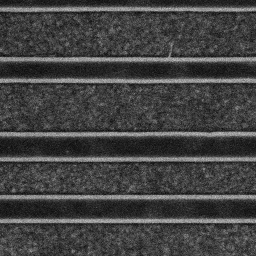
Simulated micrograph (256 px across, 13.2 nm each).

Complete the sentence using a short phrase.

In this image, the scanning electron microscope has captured one or a few lines or trenches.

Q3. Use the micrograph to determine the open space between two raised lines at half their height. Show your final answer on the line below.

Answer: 0.651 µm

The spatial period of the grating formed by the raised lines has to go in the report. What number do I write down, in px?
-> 69.4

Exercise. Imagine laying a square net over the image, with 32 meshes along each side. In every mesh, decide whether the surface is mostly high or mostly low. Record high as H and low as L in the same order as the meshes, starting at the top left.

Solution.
HHHHHHHHHHHHHHHHHHHHHHHHHHHHHHHH
LLLLLLLLLLLLLLLLLLLLLLLLLLLLLLLL
LLLLLLLLLLLLLLLLLLLLLLLLLLLLLLLL
LLLLLLLLLLLLLLLLLLLLLLLLLLLLLLLL
LLLLLLLLLLLLLLLLLLLLLLLLLLLLLLLL
LLLLLLLLLLLLLLLLLLLLLLLLLLLLLLLL
LLLLLLLLLLLLLLLLLLLLLLLLLLLLLLLL
HHHHHHHHHHHHHHHHHHHHHHHHHHHHHHHH
HHHHHHHHHHHHHHHHHHHHHHHHHHHHHHHH
HHHHHHHHHHHHHHHHHHHHHHHHHHHHHHHH
LLLLLLLLLLLLLLLLLLLLLLLLLLLLLLLL
LLLLLLLLLLLLLLLLLLLLLLLLLLLLLLLL
LLLLLLLLLLLLLLLLLLLLLLLLLLLLLLLL
LLLLLLLLLLLLLLLLLLLLLLLLLLLLLLLL
LLLLLLLLLLLLLLLLLLLLLLLLLLLLLLLL
LLLLLLLLLLLLLLLLLLLLLLLLLLLLLLLL
LLLLLLLLLLLLLLLLLLLLLLLLLLLLLLLL
HHHHHHHHHHHHHHHHHHHHHHHHHHHHHHHH
HHHHHHHHHHHHHHHHHHHHHHHHHHHHHHHH
HHHHHHHHHHHHHHHHHHHHHHHHHHHHHHHH
LLLLLLLLLLLLLLLLLLLLLLLLLLLLLLLL
LLLLLLLLLLLLLLLLLLLLLLLLLLLLLLLL
LLLLLLLLLLLLLLLLLLLLLLLLLLLLLLLL
LLLLLLLLLLLLLLLLLLLLLLLLLLLLLLLL
LLLLLLLLLLLLLLLLLLLLLLLLLLLLLLLL
HHHHHHHHHHHHHHHHHHHHHHHHHHHHHHHH
HHHHHHHHHHHHHHHHHHHHHHHHHHHHHHHH
HHHHHHHHHHHHHHHHHHHHHHHHHHHHHHHH
LLLLLLLLLLLLLLLLLLLLLLLLLLLLLLLL
LLLLLLLLLLLLLLLLLLLLLLLLLLLLLLLL
LLLLLLLLLLLLLLLLLLLLLLLLLLLLLLLL
LLLLLLLLLLLLLLLLLLLLLLLLLLLLLLLL